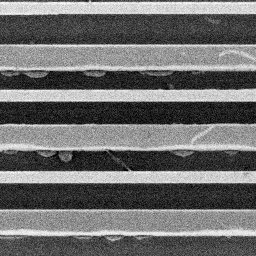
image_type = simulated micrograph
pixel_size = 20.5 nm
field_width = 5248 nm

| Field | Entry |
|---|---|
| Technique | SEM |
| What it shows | lines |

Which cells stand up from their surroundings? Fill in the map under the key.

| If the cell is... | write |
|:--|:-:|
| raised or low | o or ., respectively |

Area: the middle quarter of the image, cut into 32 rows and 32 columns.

oooooooooooooooooooooooooooooooo
................................
................................
................................
................................
................................
................................
oooooooooooooooooooooooooooooooo
oooooooooooooooooooooooooooooooo
................................
................................
................................
................................
................................
................................
oooooooooooooooooooooooooooooooo
oooooooooooooooooooooooooooooooo
oooooooooooooooooooooooooooooooo
oooooooooooooooooooooooooooooooo
oooooooooooooooooooooooooooooooo
oooooooooooooooooooooooooooooooo
..........o.....................
................................
................................
................................
................................
................................
oooooooooooooooooooooooooooooooo
oooooooooooooooooooooooooooooooo
oooooooooooooooooooooooooooooooo
................................
................................